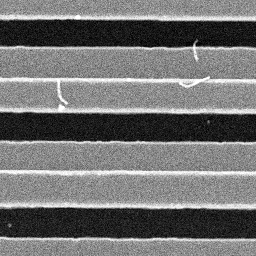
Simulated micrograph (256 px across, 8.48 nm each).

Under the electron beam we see lines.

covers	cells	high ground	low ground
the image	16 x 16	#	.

################
................
................
################
################
################
################
................
................
################
################
################
################
................
................
################